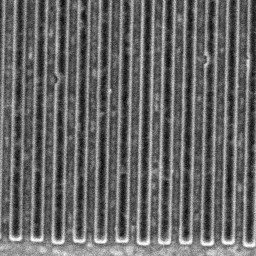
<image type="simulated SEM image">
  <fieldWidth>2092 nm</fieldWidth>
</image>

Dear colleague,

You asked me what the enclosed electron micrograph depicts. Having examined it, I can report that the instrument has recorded parallel lines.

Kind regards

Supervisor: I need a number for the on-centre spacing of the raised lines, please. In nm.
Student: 174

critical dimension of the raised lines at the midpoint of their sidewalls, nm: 100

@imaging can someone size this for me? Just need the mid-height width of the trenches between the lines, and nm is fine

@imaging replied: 78.6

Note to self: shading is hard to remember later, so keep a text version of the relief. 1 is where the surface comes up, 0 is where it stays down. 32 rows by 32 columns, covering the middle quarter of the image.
10011100011000111001110001100011
10011100011000111001110001100011
10011100011000111001110001100011
10011100011000111001110001100011
10011100011000111001110011100011
10011100011000111001110011100011
10011100111000111001110011100011
10011100111000111001110011100011
10011100111000111001110011100011
10011100111000111001110011100011
10011100111000111001110011100011
00011100111000111001110011100011
00011100111000111001110011100011
00011100111000111001110011100011
00011100111000111001110011100011
00011100111000111001110011100011
10011100111000110001110011100011
00011100111000110001110011100011
10011100111000110001110011100111
10011100111000110001110011100111
10011100111000110001110011100111
00011100111000110001110011100111
00011100111000110001110011100111
00011100111001110001110011100111
00011100111001110001110011100111
00011000111001110001110011100111
00011000111001110001110011100111
00011000111001110001110011100111
00011000111001110001110011100111
00011000111001110001110011100111
00011000111001110001110011100111
00011000111001110001100011100111